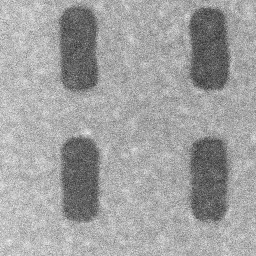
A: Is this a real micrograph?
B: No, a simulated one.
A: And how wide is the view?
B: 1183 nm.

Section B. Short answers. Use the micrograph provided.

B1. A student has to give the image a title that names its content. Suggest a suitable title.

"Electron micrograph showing raised bodies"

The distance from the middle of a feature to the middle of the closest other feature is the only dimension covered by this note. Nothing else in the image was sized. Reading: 600 nanometers